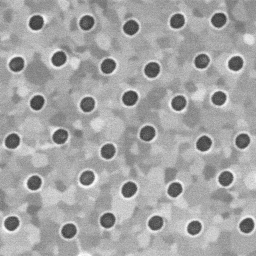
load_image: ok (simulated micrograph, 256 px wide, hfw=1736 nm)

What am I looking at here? a regular array of holes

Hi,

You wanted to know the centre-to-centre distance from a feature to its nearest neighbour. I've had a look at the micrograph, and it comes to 0.273 µm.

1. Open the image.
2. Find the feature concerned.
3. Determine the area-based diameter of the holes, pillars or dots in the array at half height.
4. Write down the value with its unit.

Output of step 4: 16.3 px